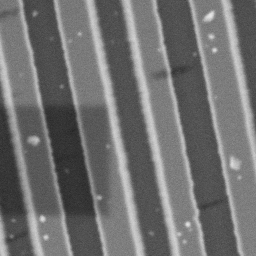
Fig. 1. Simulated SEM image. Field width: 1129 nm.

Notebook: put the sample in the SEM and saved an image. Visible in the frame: lines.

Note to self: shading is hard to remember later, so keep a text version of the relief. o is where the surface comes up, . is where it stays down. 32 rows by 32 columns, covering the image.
ooo....oooo.....ooo.....oooo....
ooo....oooo.....oooo....oooo....
ooo....ooooo....oooo....ooooo...
ooo....ooooo....oooo....ooooo...
ooo.....oooo.....ooo.....oooo...
oooo....oooo.....ooo.....oooo...
oooo....oooo.....oooo....oooo...
oooo....ooooo....oooo....ooooo..
oooo....ooooo....oooo....ooooo..
ooooo....oooo.....ooo.....oooo..
.oooo....oooo.....ooo.....oooo..
.oooo....oooo.....oooo....oooo..
.oooo....ooooo....oooo....ooooo.
.oooo....ooooo....oooo....ooooo.
..ooo.....oooo.....ooo.....oooo.
..oooo....oooo.....ooo.....oooo.
..oooo....oooo.....oooo....oooo.
..oooo....ooooo....oooo....ooooo
..oooo....ooooo....oooo....ooooo
..oooo.....oooo.....ooo.....oooo
...oooo....oooo.....oooo....oooo
...oooo....oooo.....oooo....oooo
...oooo....ooooo....oooo....oooo
...oooo....ooooo....oooo....oooo
...oooo.....oooo.....ooo.....ooo
....oooo....oooo.....ooo.....ooo
....oooo....oooo.....oooo....ooo
....oooo....ooooo....oooo....ooo
....oooo....ooooo....oooo....ooo
....oooo.....oooo.....ooo....ooo
.....oooo....oooo.....ooo.....oo
.....oooo....oooo.....oooo....oo